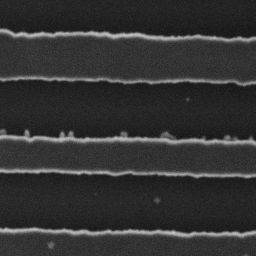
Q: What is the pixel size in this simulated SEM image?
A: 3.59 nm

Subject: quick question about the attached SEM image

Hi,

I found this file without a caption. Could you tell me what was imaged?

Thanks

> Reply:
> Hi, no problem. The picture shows lines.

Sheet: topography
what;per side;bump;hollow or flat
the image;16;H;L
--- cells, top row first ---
LLLLLLLLLLLLLLLL
LLLLLLLLLLLLLLLL
HHHHHHHHHHHHHHHH
HHHHHHHHHHHHHHHH
HHHHHHHHHHHHHHHH
LLLLLLLLLLLLLLLL
LLLLLLLLLLLLLLLL
LLLLLLLLLLLLLLLL
HLLLLLLLLLLLLLLL
HHHHHHHHHHHHHHHH
HHHHHHHHHHHHHHHH
LLLLLLLLLLLLLLLL
LLLLLLLLLLLLLLLL
LLLLLLLLLLLLLLLL
HHHHHHHHHHHLLLLL
HHHHHHHHHHHHHHHH